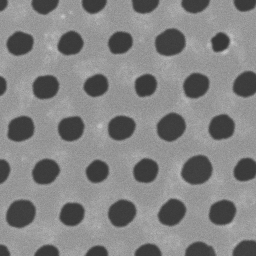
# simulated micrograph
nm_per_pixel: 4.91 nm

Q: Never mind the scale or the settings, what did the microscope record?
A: a regular array of holes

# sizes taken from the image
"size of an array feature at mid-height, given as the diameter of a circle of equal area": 124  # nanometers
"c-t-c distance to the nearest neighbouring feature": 0.24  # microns